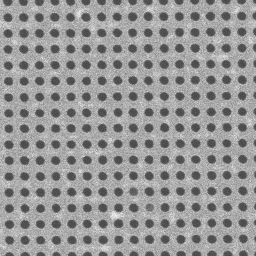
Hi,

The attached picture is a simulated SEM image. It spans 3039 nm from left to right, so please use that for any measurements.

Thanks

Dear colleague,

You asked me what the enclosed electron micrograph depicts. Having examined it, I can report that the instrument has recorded a regular array of holes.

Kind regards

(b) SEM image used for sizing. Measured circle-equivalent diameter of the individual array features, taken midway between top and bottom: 8.96 px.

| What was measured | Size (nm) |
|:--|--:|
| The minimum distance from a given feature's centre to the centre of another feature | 182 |